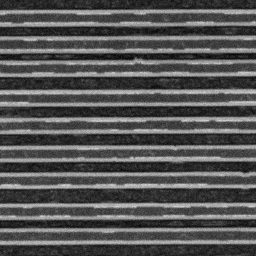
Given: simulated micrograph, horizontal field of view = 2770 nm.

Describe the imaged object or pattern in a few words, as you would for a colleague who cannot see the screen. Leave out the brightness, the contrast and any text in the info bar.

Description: parallel lines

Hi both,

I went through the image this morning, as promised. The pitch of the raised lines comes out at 295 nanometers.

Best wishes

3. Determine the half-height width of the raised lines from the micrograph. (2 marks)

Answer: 146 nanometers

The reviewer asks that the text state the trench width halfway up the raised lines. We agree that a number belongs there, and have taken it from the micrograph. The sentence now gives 145 nm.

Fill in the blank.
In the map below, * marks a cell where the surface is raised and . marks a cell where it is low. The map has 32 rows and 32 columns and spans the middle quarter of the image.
********************************
********************************
********************************
................................
................................
................................
................................
********************************
********************************
********************************
................................
................................
................................
................................
********************************
********************************
********************************
................................
................................
................................
................................
********************************
********************************
********************************
................................
................................
................................
............******......********
********************************
********************************
********************************
................................